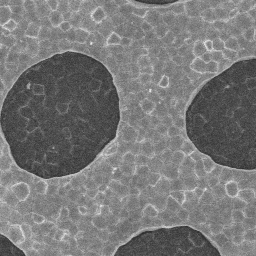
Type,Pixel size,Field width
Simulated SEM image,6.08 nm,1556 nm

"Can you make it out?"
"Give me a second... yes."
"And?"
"holes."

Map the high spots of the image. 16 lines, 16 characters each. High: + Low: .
++++++++++++++++
++++++++++++++++
++++++++++++++++
+++...++++++++++
++.....+++++++..
+......++++++...
.......+++++....
.......+++++....
.......+++++....
+.....+++++++...
+....++++++++++.
++++++++++++++++
++++++++++++++++
++++++++++++++++
+++++++++...++++
.+++++++.....+++